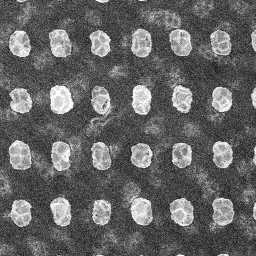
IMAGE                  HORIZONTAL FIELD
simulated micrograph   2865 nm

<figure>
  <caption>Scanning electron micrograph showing a regular array of raised bodies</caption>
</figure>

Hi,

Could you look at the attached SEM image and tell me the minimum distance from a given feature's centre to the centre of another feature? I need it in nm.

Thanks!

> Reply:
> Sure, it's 448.